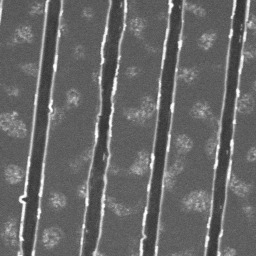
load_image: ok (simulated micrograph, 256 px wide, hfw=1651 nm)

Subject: one or a few lines or trenches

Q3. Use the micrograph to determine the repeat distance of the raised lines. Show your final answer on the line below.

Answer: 395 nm